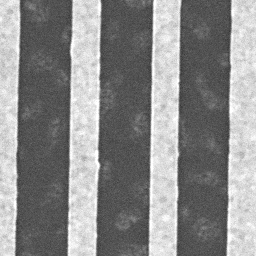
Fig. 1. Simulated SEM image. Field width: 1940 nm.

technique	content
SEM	one or a few lines or trenches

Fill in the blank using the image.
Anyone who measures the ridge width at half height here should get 26.6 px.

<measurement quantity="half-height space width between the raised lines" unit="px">53.4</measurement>